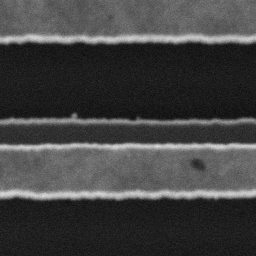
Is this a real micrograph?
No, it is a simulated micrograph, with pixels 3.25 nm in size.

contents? lines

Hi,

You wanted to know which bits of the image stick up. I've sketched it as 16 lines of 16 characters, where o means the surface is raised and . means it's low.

oooooooooooooooo
oooooooooooooooo
oooooooo..oooo.o
................
................
................
................
................
oooooooooooooooo
oooooooooooooooo
oooooooooooooooo
oooooooooooooooo
................
................
................
................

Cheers